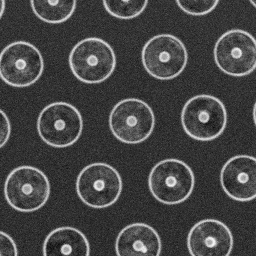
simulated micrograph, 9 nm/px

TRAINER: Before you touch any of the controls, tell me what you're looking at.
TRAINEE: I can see an array of small figures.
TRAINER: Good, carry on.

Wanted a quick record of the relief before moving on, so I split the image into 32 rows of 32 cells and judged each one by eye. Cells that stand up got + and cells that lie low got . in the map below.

++++.....++++.....++++.....+++++
+++++....+++++...+++++++..++++++
++++++..++++++++++++++++++++++++
++++++++++++++++++++++++++++++++
++++++++++++++++++++++++++++...+
++.+++++++...++++++....++++.....
.....++++.....++++.....++++..+..
.....++++..+..++++..+..++++.....
..+..++++.....++++.....+++++....
.....+++++...+++++++..++++++++++
++..++++++++++++++++++++++++++++
++++++++++++++++++++++++++++++++
++++++++++++++++++++++++...+++++
++++++...+++++....+++++.....++++
.++++.....++++.....++++..+..++++
.++++..+..++++..+..++++.....++++
.++++.....++++.....+++++...+++++
.+++++...++++++..+++++++++++++++
++++++++++++++++++++++++++++++++
++++++++++++++++++++++++++++++++
++++++++++++++++++++...+++++....
++...+++++....+++++.....++++....
+.....++++.....++++..+..++++..+.
+..+..++++..+..++++.....++++....
+.....++++.....++++....++++++...
+....++++++...++++++++++++++++++
++++++++++++++++++++++++++++++++
++++++++++++++++++++++++++++++++
++++++++++++++++...+++++....++++
.+++++....+++++.....++++.....+++
..++++.....++++..+..++++..+..+++
..++++..+..++++.....++++.....+++